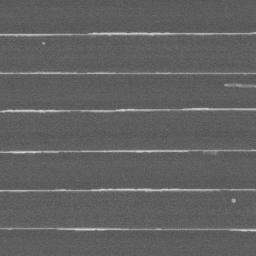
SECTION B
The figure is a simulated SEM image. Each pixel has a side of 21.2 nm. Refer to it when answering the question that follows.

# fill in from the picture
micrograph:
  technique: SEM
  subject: lines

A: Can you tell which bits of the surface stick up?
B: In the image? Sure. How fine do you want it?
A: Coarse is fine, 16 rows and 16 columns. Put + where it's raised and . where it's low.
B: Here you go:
................
................
++++++++++++++++
++++++++++++++++
++++++++++++++++
................
................
++++++++++++++++
++++++++++++++++
+++.............
................
................
++++++++++++++++
++++++++++++++++
................
................